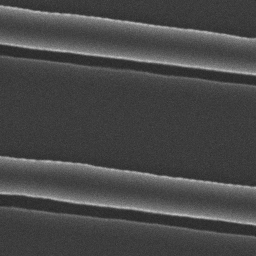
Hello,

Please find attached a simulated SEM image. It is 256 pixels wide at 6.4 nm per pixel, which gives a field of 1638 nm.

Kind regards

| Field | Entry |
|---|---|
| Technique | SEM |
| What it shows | lines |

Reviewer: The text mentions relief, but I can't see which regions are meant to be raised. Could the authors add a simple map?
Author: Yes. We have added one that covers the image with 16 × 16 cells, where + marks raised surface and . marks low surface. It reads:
+...............
+++++++++.......
++++++++++++++++
......++++++++++
...............+
................
................
................
................
................
++++++..........
++++++++++++++..
....++++++++++++
............++++
................
................